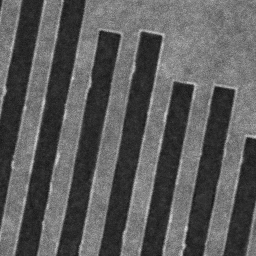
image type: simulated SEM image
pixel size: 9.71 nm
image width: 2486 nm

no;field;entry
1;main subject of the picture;parallel lines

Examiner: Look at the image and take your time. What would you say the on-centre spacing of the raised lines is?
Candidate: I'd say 397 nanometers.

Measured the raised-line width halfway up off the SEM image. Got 0.178 um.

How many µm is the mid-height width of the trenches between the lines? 0.213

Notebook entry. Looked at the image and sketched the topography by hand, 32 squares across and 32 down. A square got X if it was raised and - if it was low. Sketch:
XXX---XX---XXXXXXXXXXXXXXXXXXXXX
XX---XXX---XXXXXXXXXXXXXXXXXXXXX
XX---XX---XXXXXXXXXXXXXXXXXXXXXX
XX---XX---XXXXXXXXXXXXXXXXXXXXXX
XX---XX---XX---XX---XXXXXXXXXXXX
XX---XX---XX---XX---XXXXXXXXXXXX
X---XXX---XX---XX---XXXXXXXXXXXX
X---XXX--XXX---XX---XXXXXXXXXXXX
X---XX---XXX--XXX---XXXXXXXXXXXX
X---XX---XX---XX---XXXXXXXXXXXXX
X---XX---XX---XX---XXX--XXXXXXXX
X--XXX---XX---XX---XX---XXX--XXX
---XXX--XXX---XX---XX---XX---XXX
---XX---XXX--XXX---XX---XX---XXX
---XX---XX---XXX--XXX---XX---XXX
---XX---XX---XXX--XXX--XXX---XXX
--XXX---XX---XX---XX---XXX---XXX
--XXX--XXX---XX---XX---XX---XXX-
--XX---XXX--XXX---XX---XX---XX--
--XX---XX---XXX--XXX---XX---XX--
-XXX---XX---XX---XXX---XX---XX--
-XXX---XX---XX---XX---XXX---XX--
-XXX--XXX---XX---XX---XX---XXX--
-XXX--XXX--XXX---XX---XX---XXX--
-XX---XXX--XXX--XXX---XXXXXXX---
-XX---XX---XXX--XXX---XX--XXX---
-XX---XX---XX---XX---XXX--XXX---
XXX--XXX---XX---XX---XXX--XXX---
XX---XXX---XX---XX---XX---XXX--X
XX---XXX--XXX--XXX---XX---XX---X
XX---XX---XXX--XXX---XX---XX---X
XX--XXX-XXXX---XXX--XXX---XX---X